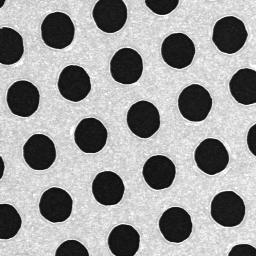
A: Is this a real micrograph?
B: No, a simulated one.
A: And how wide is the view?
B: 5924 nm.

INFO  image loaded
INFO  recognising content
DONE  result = a regular array of holes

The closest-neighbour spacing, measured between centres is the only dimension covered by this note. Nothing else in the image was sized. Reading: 1250 nm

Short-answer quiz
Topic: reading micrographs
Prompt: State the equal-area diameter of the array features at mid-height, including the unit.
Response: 0.813 microns